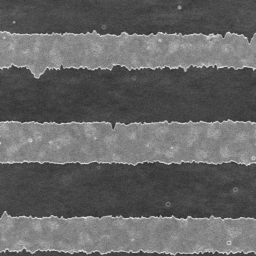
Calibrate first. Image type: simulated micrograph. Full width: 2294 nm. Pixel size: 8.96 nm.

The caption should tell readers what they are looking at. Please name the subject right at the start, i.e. one or a few lines or trenches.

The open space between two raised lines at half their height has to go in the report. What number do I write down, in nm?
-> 490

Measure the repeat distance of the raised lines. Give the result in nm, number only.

822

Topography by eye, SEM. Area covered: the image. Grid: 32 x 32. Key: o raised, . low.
................................
................................
................................
................................
oooooooooooooooooooooooooo..oo..
oooooooooooooooooooooooooo.ooooo
oooooooooooooooooooooooooooooooo
oooooooooooooooooooooooooooooooo
...oooo..o.ooo..oo...........o.o
....o...........................
................................
................................
................................
................................
................................
oooooooooooooo..oooooooooooooooo
oooooooooooooooooooooooooooooooo
oooooooooooooooooooooooooooooooo
oooooooooooooooooooooooooooooooo
oooooooooooooooooooooooooooooooo
................o.............o.
................................
................................
................................
................................
................................
................................
oooooooooooooooooooooooooooooooo
oooooooooooooooooooooooooooooooo
oooooooooooooooooooooooooooooooo
oooooooooooooooooooooooooooooooo
........o.oooo..o.oooooooooooooo